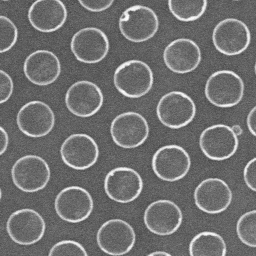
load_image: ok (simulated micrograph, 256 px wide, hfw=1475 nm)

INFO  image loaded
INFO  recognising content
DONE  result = a regular array of raised bodies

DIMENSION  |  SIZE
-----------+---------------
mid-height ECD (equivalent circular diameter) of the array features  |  0.207 µm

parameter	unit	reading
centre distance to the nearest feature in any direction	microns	0.302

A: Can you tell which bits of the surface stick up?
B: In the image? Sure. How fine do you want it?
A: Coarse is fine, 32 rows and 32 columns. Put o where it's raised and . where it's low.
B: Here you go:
....oooo..oooo.......ooooo......
....oooo........ooo...ooo.......
o...oooo.......ooooo...o....o...
oo...oo........ooooo.......oooo.
oo.......oooo...ooo........oooo.
oo.......oooo........ooo...oooo.
....oo...oooo........oooo...oo..
...oooo...oo.........oooo.......
...oooo........oooo..ooo........
o..oooo.......ooooo.......oooo..
oo...o...ooo..ooooo.......oooo..
o.......ooooo..ooo........oooo..
o.......ooooo.......oooo..oooo..
...ooo...ooo........oooo........
..ooooo........ooo..oooo.......o
..ooooo.......oooo...oo........o
o..ooo........oooo.......oooo..o
o.......oooo..oooo.......ooooo..
o.......oooo........ooo..ooooo..
........oooo.......oooo...ooo...
..oooo..oooo.......ooooo.......o
..oooo........ooo..oooo........o
..oooo.......ooooo...o....o....o
..ooo....o...ooooo.......oooo..o
.......oooo...ooo.......ooooo...
.......oooo........ooo...oooo...
..oo...oooo.......oooo....o....o
.oooo...oo........ooooo.......oo
.ooooo.......ooo...ooo........oo
.oooo.......ooooo........oo...oo
.......ooo..ooooo.......oooo...o
......ooooo..ooo........oooo....